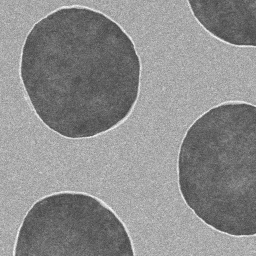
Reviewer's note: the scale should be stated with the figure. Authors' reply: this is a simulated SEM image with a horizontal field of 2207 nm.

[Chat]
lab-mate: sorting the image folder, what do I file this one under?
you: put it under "holes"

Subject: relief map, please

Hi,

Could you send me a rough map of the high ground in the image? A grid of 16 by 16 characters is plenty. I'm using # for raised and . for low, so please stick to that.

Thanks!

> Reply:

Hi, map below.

############....
##.....######...
##......######..
#........#######
#........#######
##.......#######
##......######.#
###.....####....
####..######....
###########.....
###########.....
###########.....
###...######....
##.....#####....
#.......######..
#.......########